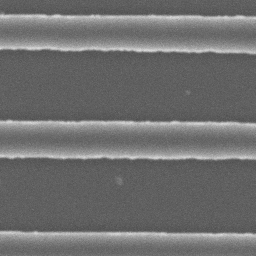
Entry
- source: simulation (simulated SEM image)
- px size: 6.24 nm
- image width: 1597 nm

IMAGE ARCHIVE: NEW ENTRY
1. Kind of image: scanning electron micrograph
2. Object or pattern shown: lines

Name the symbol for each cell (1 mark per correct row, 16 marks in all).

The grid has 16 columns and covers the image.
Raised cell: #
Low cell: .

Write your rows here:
................
################
################
................
................
................
................
................
################
################
................
................
................
................
................
################